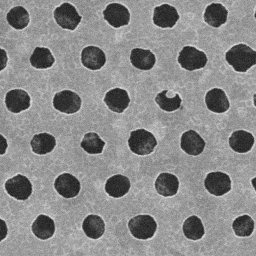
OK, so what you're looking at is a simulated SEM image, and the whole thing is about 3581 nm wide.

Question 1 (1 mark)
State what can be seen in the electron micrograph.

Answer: a regular array of holes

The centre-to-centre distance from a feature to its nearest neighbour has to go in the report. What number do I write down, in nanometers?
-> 670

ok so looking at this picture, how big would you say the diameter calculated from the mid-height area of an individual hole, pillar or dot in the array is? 345 nanometres